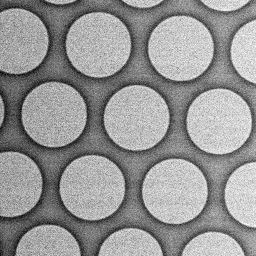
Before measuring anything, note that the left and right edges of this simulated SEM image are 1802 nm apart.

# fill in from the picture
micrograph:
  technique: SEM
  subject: an array of small figures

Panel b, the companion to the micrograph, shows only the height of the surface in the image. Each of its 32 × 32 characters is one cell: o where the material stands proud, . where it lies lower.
................oooo......ooooo.
oooo............................
ooooo.....ooooo......ooo........
oooooo...ooooooo....oooooo....oo
oooooo..oooooooo...ooooooo...ooo
oooooo..oooooooo...oooooooo..ooo
oooooo..oooooooo...oooooooo..ooo
ooooo....ooooooo...ooooooo...ooo
oooo......ooooo....ooooooo...ooo
...........oo........oooo.....oo
.....ooo........................
....oooooo.....oooo.......ooo...
...ooooooo....oooooo....oooooo..
...oooooooo..oooooooo...ooooooo.
...oooooooo..oooooooo..oooooooo.
...oooooooo..oooooooo..oooooooo.
...ooooooo...oooooooo...ooooooo.
....ooooo.....oooooo....ooooooo.
................ooo......ooooo..
ooo.............................
oooo.....ooooo......oooo.......o
ooooo...ooooooo....oooooo....ooo
ooooo...ooooooo...oooooooo...ooo
ooooo...oooooooo..oooooooo..oooo
ooooo...ooooooo...oooooooo..oooo
oooo....ooooooo...oooooooo..oooo
ooo......ooooo.....oooooo....ooo
....................oooo......oo
....oooo........................
...oooooo.....ooooo......ooo....
..oooooooo...ooooooo....oooooo..
..oooooooo..oooooooo...ooooooo..